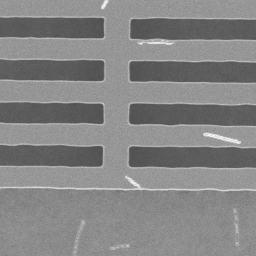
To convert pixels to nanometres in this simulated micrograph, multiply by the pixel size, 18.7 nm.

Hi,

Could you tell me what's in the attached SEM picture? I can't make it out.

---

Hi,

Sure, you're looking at groups of lines, slits or small figures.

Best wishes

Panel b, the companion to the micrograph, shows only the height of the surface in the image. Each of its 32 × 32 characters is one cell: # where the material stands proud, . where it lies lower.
################################
################################
.............####...............
.............###................
.............###................
################################
################################
............####################
.............###................
.............###................
################################
################################
################################
.............###................
.............###................
##....#...#.#####...............
################################
################################
.............###................
.............###................
.............###................
################################
################################
.........#######################
................................
................................
................................
................................
................................
................................
................................
................................